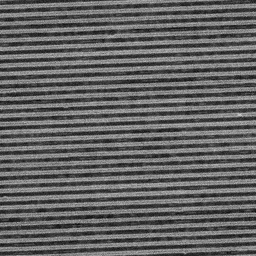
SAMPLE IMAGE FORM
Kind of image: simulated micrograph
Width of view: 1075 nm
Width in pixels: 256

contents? parallel lines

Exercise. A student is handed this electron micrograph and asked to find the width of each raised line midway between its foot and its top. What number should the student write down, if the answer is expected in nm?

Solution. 15.7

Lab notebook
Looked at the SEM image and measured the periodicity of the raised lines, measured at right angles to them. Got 8.36 px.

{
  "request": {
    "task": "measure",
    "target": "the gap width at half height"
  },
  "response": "19.9 nm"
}